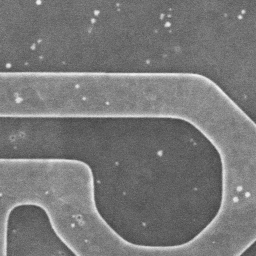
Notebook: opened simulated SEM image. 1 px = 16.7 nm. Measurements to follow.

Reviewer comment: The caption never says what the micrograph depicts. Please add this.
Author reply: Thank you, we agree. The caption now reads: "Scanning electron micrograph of wiring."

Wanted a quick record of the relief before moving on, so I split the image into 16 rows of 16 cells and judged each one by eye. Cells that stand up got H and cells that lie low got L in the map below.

LLLLLLLLLLLLLLLL
LLLLLLLLLLLLLLLL
LLLLLLLLLLLLLLLL
LLLLLLLLLLLLLLLL
LLLLLLLLLLLLLLLL
HHHHHHHHHHHHHHLL
HHHHHHHHHHHHHHHL
LLLLLLLLLLLHHHHH
LLLLLLLLLLLLLHHH
LLLLLLLLLLLLLLHH
HHHHHHLLLLLLLLHH
HHHHHHLLLLLLLLHH
HHHHHHLLLLLLLLHH
HLLHHHLLLLLLLHHH
LLLHHHHLLLLLLHHH
LLLLHHHHHHHHHHHL